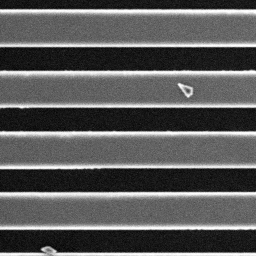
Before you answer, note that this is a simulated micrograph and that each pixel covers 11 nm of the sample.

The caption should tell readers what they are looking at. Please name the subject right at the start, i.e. lines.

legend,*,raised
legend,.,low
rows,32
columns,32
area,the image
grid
................................
********************************
********************************
********************************
********************************
********************************
................................
................................
................................
********************************
********************************
********************************
********************************
................................
................................
................................
................................
********************************
********************************
********************************
********************************
................................
................................
................................
********************************
********************************
********************************
********************************
********************************
................................
................................
.....**.........................